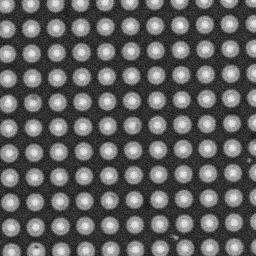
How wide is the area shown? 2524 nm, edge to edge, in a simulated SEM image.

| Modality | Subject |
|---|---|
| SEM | an array of small figures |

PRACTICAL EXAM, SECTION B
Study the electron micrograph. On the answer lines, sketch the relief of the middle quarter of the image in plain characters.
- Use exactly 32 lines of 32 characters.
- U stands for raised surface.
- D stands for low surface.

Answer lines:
DDDDDDDDDDDDDDDDDDDDDDDDDDDDDDDD
DDDUUUDDDUUUDDDUUUDDDDUUUDDDUUUD
DDUUUUUDDUUUUDDUUUUDDUUUUDDUUUUD
DDUUUUUDDUUUUDDUUUUDDUUUUDDUUUUD
DDDUUUDDDUUUDDDUUUDDDDUUUDDDUUDD
DDDDDDDDDDDDDDDDDDDDDDDDDDDDDDDD
DDDDDDDDDDDDDDDDDDDDDDDDDDDDDDDD
DDDDUDDDDDUUDDDDUUDDDDUUUDDDUUUD
DDDUUUUDDUUUUDDUUUUDDUUUUDDUUUUD
UDDUUUUDDUUUUDDUUUUDDUUUUDDUUUUD
DDDUUUDDDUUUUDDUUUUDDDUUUDDDUUUD
DDDDUDDDDDDDDDDDDDDDDDDDDDDDDDDD
DDDDDDDDDDDDDDDDDDDDDDDDDDDDDDDD
DDDDDDDDDDUUDDDDUUDDDDUUUDDDUUUD
DDDUUUUDDUUUUDDUUUUDDUUUUDDUUUUU
UDDUUUUDDUUUUDDUUUUDDUUUUDDDUUUU
UDDUUUUDDUUUUDDUUUUDDDUUUDDDUUUD
DDDDUUDDDDUUDDDDDUDDDDDDDDDDDDDD
DDDDDDDDDDDDDDDDDDDDDDDDDDDDDDDD
DDDDDDDDDDDDDDDDDDDDDDDUDDDDUUUD
DDDUUUUDDUUUUDDUUUUDDDUUUDDDUUUU
UDDUUUUDDUUUUDDUUUUDDUUUUUDDUUUU
UDDUUUUDDUUUUDDUUUUDDDUUUDDDUUUU
DDDDUUDDDDUUDDDDUUDDDDDUDDDDDDDD
DDDDDDDDDDDDDDDDDDDDDDDDDDDDDDDD
DDDDDDDDDDDDDDDDDDDDDDDDDDDDDUUD
DDDDUUDDDDUUUDDDUUUDDDUUUDDDUUUU
UDDUUUUDDUUUUDDUUUUUDDUUUUDDUUUU
UDDUUUUDDUUUUDDUUUUDDDUUUUDDUUUU
UDDUUUUDDDUUUDDDUUUDDDDUUDDDDUUD
DDDDDDDDDDDDDDDDDDDDDDDDDDDDDDDD
DDDDDDDDDDDDDDDDDDDDDDDDDDDDDDDD